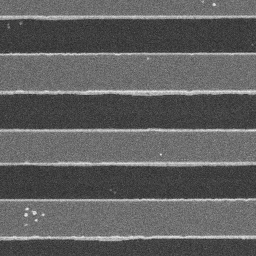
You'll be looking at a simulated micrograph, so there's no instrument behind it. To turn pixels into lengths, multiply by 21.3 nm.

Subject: lines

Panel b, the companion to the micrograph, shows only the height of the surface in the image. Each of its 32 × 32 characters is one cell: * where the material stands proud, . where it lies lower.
********************************
********************************
................................
................................
................................
................................
................................
********************************
********************************
********************************
********************************
**.*********....*****..*........
................................
................................
................................
................................
********************************
********************************
********************************
********************************
................................
................................
................................
................................
................................
********************************
********************************
********************************
********************************
********************************
................................
................................